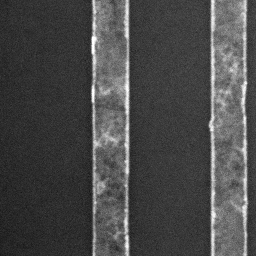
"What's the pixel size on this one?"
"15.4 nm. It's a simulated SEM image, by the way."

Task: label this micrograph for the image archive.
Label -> one or a few lines or trenches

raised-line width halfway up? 532 nanometres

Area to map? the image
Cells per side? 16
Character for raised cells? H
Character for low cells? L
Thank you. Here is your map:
LLLLLLHHLLLLLHHL
LLLLLLHHLLLLLHHL
LLLLLLHHLLLLLHHL
LLLLLLHHLLLLLHHL
LLLLLLHHLLLLLHHL
LLLLLLHHLLLLLHHL
LLLLLLHHLLLLLHHL
LLLLLLHHLLLLLHHL
LLLLLLHHLLLLLHHL
LLLLLLHHLLLLLHHL
LLLLLLHHLLLLLHHL
LLLLLLHHLLLLLHHL
LLLLLLHHLLLLLHHL
LLLLLLHHLLLLLHHL
LLLLLLHHLLLLLHHL
LLLLLLHHLLLLLHHL